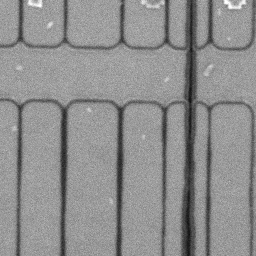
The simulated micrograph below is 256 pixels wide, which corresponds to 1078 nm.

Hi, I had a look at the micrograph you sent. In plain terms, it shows wiring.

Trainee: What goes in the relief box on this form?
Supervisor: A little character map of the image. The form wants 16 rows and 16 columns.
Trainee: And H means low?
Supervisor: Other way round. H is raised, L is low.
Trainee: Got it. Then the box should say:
HHHHHHHHHHHHHHHH
HHHHHHHHHHHHHHHH
HHHHHHHHHHHHHHHH
LLLLLLLLLLLLLLLL
LLLLLLLLLLLLLLLL
LLLLLLLLLLLLLLLL
HHHHHHHHHHHHHHHH
HHHHHHHHHHHHHHHH
HHHHHHHHHHHHHHHH
HHHHHHHHHHHHHHHH
HHHHHHHHHHHHHHHH
HHHHHHHHHHHHHHHH
HHHHHHHHHHHHHHHH
HHHHHHHHHHHHHHHH
HHHHHHHHHHHHHHHH
HHHHHHHHHHHHHHHH